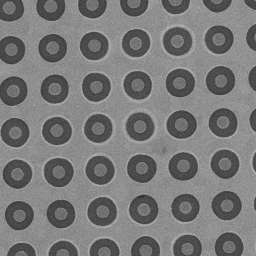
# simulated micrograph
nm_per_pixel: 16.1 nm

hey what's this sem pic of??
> an array of small figures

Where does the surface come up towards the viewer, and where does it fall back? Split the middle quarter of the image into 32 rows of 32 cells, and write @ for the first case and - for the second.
@@@@@@@@@@@@@@@@@@@@@@@@@@@@@@@@
@@@@@@@@@@@@@@@@@@@@@@@@@@@----@
@@@@@@----@@@@@@-----@@@@@------
@@@@@------@@@@-------@@@@--@---
-@@@@--@@---@@@--@@@--@@@--@@@--
-@@@---@@---@@@--@@@--@@@---@@--
-@@@@--@@---@@@---@---@@@@------
-@@@@------@@@@-------@@@@-----@
-@@@@------@@@@@-----@@@@@@@@@@@
@@@@@@@--@@@@@@@@@@@@@@@@@@@@@@@
@@@@@@@@@@@@@@@@@@@@@@@@@@@@@@@@
@@@@@@@@@@@@@@@@@@@@@@@@@@@@@@@@
@@@@@@@---@@@@@@@----@@@@@@-----
@@@@@@-----@@@@@------@@@@------
-@@@@-------@@@---@@---@@---@@@-
--@@@--@@@--@@@---@@---@@---@@@-
--@@@--@@@--@@@---@@---@@@--@@--
--@@@---@---@@@--------@@@------
--@@@@------@@@@------@@@@@@---@
-@@@@@@---@@@@@@@@@-@@@@@@@@@@@@
@@@@@@@@@@@@@@@@@@@@@@@@@@@@@@@@
@@@@@@@@@@@@@@@@@@@@@@@@@@@@@@@@
@@@@@@@@@@@@@@@@@@--@@@@@@@@----
@@@@@@@----@@@@@@-----@@@@@-----
--@@@@------@@@@-------@@@---@@-
--@@@---@@---@@@--@@@--@@@--@@@-
---@@---@@---@@@--@@@--@@@---@@-
---@@---@@---@@@-------@@@@-----
--@@@@------@@@@@-----@@@@@-----
--@@@@@-----@@@@@@---@@@@@@@@@@@
@@@@@@@@@@@@@@@@@@@@@@@@@@@@@@@@
@@@@@@@@@@@@@@@@@@@@@@@@@@@@@@@@